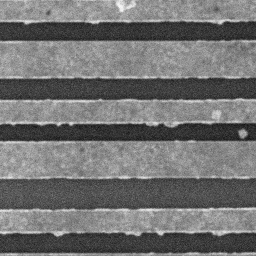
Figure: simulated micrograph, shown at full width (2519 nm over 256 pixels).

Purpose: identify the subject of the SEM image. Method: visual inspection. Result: lines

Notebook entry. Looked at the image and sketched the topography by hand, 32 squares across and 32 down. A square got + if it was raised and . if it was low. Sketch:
++++++++++++++++++++++++++++++++
++++++++++++++++++++++++++++++++
++++++++++++++++++++++++++++++++
................................
................................
++++++++++++++++++++++++++++++++
++++++++++++++++++++++++++++++++
++++++++++++++++++++++++++++++++
++++++++++++++++++++++++++++++++
++++++++++++++++++++++++++++++++
................................
................................
.............................+..
++++++++++++++++++++++++++++++++
++++++++++++++++++++++++++++++++
................................
................................
................................
++++++++++++++++++++++++++++++++
++++++++++++++++++++++++++++++++
++++++++++++++++++++++++++++++++
++++++++++++++++++++++++++++++++
................................
................................
................................
................................
++++++++++++++++++++++++++++++++
++++++++++++++++++++++++++++++++
++++++++++++++++++++++++++++++++
................................
................................
................................